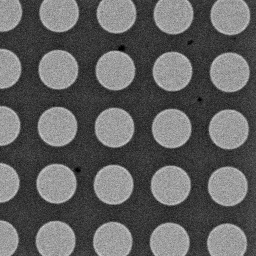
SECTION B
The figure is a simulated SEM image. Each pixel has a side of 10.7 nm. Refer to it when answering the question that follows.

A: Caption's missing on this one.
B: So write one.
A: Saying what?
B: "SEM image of an array of small figures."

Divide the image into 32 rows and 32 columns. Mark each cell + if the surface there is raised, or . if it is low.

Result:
++...+++++..+++++...++++...++++.
+++..+++++..+++++..+++++..+++++.
++...+++++..+++++..+++++..+++++.
++....+++....+++....+++....++++.
................................
................................
+.....++......+.................
++...++++...++++....++++...++++.
+++..+++++..+++++..+++++..+++++.
++...+++++..+++++..+++++..+++++.
++....+++....+++....+++....++++.
................................
................................
+.....++........................
++...++++...++++....+++....+++..
++...+++++..+++++..+++++..+++++.
++...+++++..+++++..+++++..+++++.
++...++++...++++...++++....++++.
.....................+......+...
................................
+...............................
++...++++...++++....+++....+++..
++...++++...+++++..+++++..+++++.
++...++++...+++++..+++++..+++++.
++...++++...++++...++++...+++++.
.....................+......++..
................................
................................
++...++++...++++....+++....+++..
++...++++...++++...+++++..+++++.
++...++++...++++...+++++..+++++.
++...++++...++++...++++...+++++.